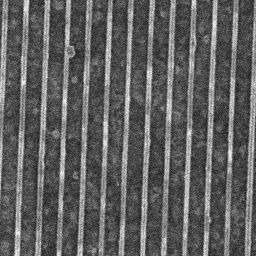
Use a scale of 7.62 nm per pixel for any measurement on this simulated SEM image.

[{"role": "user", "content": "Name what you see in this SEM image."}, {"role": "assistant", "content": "parallel lines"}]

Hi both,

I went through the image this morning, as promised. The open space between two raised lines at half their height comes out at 17.1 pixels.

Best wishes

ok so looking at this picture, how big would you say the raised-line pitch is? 160 nanometers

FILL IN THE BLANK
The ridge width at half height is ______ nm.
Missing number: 32.4